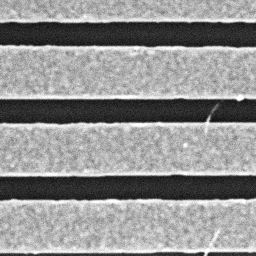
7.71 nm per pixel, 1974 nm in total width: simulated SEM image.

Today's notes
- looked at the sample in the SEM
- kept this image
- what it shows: lines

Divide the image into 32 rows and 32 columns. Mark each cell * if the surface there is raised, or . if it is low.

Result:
********************************
********************************
********************************
................................
................................
................................
********************************
********************************
********************************
********************************
********************************
********************************
................................
................................
................................
*...**...***********************
********************************
********************************
********************************
********************************
********************************
********************************
................................
................................
................................
********************************
********************************
********************************
********************************
********************************
********************************
*******************....***......